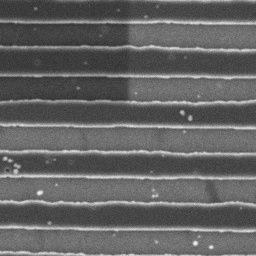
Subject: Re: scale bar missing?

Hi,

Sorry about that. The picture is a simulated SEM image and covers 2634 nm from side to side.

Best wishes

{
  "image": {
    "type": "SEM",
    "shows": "lines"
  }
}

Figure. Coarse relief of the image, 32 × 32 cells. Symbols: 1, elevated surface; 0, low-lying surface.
11111111111111111111111111111111
11111111111111111111111111111111
11111111111111111111111111111111
00000000000000000000000000000000
00000000000000000000000000000000
00000000000000000000000000000000
11111111111111111111111111111111
11111111111111111111111111111111
11111111111111111111111111111111
00011100100001111111111111111111
00000000000000000000000000000000
00000000000000000000000000000000
00001100000000000000000000000000
11111111111111111111111111111111
11111111111111111111111111111111
11111111111111111111111111111111
00000000000000000000000000000000
00000000000000000000000000000000
00000000000000000000000000000000
11111111111111111111111111111111
11111111111111111111111111111111
11111111111111111111111111111111
00000000000000000000000000000000
00000000000000000000000000000000
00000000000000000000000000000000
11111111111111111111111111111110
11111111111111111111111111111111
11111111111111111111111111111111
00011111111111111111111111111111
00000000000000000000000000000000
00000000000000000000000000000000
11110000000000000000000000000000